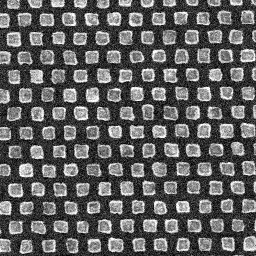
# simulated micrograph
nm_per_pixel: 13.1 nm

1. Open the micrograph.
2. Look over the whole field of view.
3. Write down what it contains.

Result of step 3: a regular array of raised bodies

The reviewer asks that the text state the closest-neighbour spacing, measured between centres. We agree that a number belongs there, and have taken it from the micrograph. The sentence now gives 0.278 um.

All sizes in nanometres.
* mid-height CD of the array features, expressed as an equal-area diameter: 168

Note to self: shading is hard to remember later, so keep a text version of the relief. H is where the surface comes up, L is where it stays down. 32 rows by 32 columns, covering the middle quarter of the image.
LLLLLLLLLLLLLLLLLLLLLLLLLLLLLLLL
LLLLLLLLLHLLLLLLLLLLHHLLLHHHLLLH
LLLHHHLLHHHLLLHHHLLLHHLLLHHHLLLH
LLLHHHLLLHHLLLHHHLLLHHLLLHHHLLLH
LLLLLLLLLLLLLLLLLLLLLLLLLLLHLLLL
LLLLLLLLLLLLLLLLLLLLLLLLLLLLLLLL
HHLLLLHHLLLLHHLLLHHLLLHHHLLLHHHL
HHHLLLHHLLLHHHLLLHHLLLHHHLLLHHHL
HHHLLLHHLLLHHHLLLHHLLLHHHLLLLLHL
LLLLLLLLLLLLLLLLLLLLLLLLLLLLLLLL
LLLLLLLLLLLLLLLLLLLLHHLLLLLLLLLL
LLLHHHLLHHHLLLHHHLLLHHLLLHHHLLLH
LLLHHHLLLHHLLLHHHLLLHHLLLHHHLLLH
LLLHHHLLLHHLLLLHHLLLHHLLLLHHLLLH
LLLLLLLLLLLLLLLLLLLLLLLLLLLLLLLL
LLLLLLLLLLLLLLLLLLLLLLLLLLLLHHLL
HHHLLLHHLLLHHHLLLHHHLLHHHLLLHHHL
HHHLLLHHLLLLHHLLLHHHLLHHHLLLHHHL
HHHLLLLLLLLLLLLLLHHLLLLLLLLLLLLL
LLLLLLLLLLLLLLLLLLLLLLLLLLLLLLLL
LLLHHHLLHHHLLLHHLLLLHHLLLHHHLLLH
LLLHHHLLHHHLLLHHHLLLHHLLLHHHHLLH
LLLHHHLLLHHLLLHHHLLLHHLLLLHHLLLH
LLLLLLLLLLLLLLLLLLLLLLLLLLLLLLLL
LLLLLLLLLLLLLLLLLLLLLLLLLLLLLLLL
LHHLLLHHHLLLHHLLLHHHLLHHHLLLHHHL
HHHLLLHHHLLLHHLLLHHHLLHHHLLLHHHL
HHHLLLHHHLLLHHLLLHHHLLLHHLLLLHHL
LLLLLLLLLLLLLLLLLLLLLLLLLLLLLLLL
LLLLLLLLLLLLLLLLLLLLHLLLLLHLLLLH
LLLLHHLLLHHHLLHHHLLLHHHLLHHHLLLH
LLLHHHLLLHHHLLHHHLLLHHHLLHHHLLLH